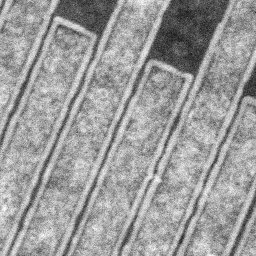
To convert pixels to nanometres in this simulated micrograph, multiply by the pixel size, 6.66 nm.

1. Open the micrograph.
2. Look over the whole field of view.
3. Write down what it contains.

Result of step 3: parallel lines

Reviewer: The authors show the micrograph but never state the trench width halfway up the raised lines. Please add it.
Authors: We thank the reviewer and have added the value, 0.267 µm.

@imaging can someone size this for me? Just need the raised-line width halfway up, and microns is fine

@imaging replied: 0.0752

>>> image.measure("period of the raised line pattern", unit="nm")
341